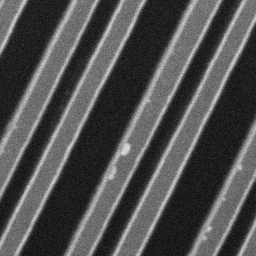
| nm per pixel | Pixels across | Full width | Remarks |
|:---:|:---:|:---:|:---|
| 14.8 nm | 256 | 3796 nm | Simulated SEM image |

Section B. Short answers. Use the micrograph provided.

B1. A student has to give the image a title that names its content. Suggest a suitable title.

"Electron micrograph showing lines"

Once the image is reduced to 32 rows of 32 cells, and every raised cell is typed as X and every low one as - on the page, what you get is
---XXXXXX---XXX---XXXXXX---XXX--
--XXXXXXX--XXXX--XXXXXXX---XXX--
--XXXXXX---XXX---XXXXXX---XXX---
-XXXXXXX--XXXX--XXXXXXX---XXX--X
-XXXXXX---XXX---XXXXXX---XXX---X
XXXXXXX--XXXX--XXXXXXX---XXX--XX
XXXXXX---XXX---XXXXXX---XXX---XX
XXXXXX--XXXX--XXXXXXX---XXX--XXX
XXXXX---XXX---XXXXXX---XXX---XXX
XXXXX--XXXX--XXXXXXX---XXX--XXXX
XXXX---XXX---XXXXXX---XXX---XXXX
XXXX--XXXX--XXXXXXX---XXX--XXXXX
XXX---XXX---XXXXXX---XXX---XXXXX
XXX--XXXX--XXXXXXX--XXXX--XXXXXX
XX---XXX---XXXXXX---XXX---XXXXXX
XX--XXXX--XXXXXXX---XXX--XXXXXXX
X---XXX---XXXXXX---XXX---XXXXXXX
X--XXXX--XXXXXXX--XXXX--XXXXXXX-
---XXX---XXXXXXX--XXX---XXXXXXX-
--XXXX--XXXXXXX--XXXX--XXXXXXX--
--XXX---XXXXXX---XXX---XXXXXXX--
-XXXX--XXXXXXX--XXXX--XXXXXXX---
-XXX---XXXXXX---XXX---XXXXXXX---
XXXX--XXXXXXX--XXXX--XXXXXXX---X
XXX---XXXXXX---XXX---XXXXXXX--XX
XXX--XXXXXXX--XXXX--XXXXXXX---XX
XX---XXXXXX---XXX---XXXXXXX---XX
XX--XXXXXXX--XXXX--XXXXXXX---XXX
X---XXXXXX---XXX---XXXXXXX---XXX
X--XXXXXXX--XXXX--XXXXXXX---XXX-
---XXXXXX---XXX---XXXXXXX--XXXX-
--XXXXXXX--XXXX--XXXXXXX---XXX--